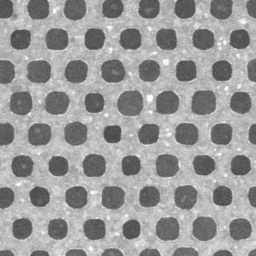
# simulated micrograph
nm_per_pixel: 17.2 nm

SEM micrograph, a regular array of holes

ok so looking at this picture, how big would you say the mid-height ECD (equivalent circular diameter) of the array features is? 0.403 microns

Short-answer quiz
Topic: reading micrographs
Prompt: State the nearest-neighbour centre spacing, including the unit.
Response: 617 nm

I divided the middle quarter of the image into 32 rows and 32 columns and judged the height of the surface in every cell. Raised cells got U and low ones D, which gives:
DDDDDDUUUDDDDDDUUUUDDDDDUUUUDDDD
DDDDDDUUUDDDDDDUUUDDDDDDUUUUDDDD
DDDDDDUUUDDDDDDUUUDDDDDDUUUUDDDD
DDDDDDUUUDDDDDDUUUUDDDDUUUUUDDDD
UDDDDUUUUUUDDDUUUUUUUDUUUUUUUUUU
UUUUUUUUUUUUUUUUUUUUUUUUUUUUUUUU
UUUUUUUUUUUUUUUUUDUUUUUUUUDUUUUU
DUUUUUDDDUUUUUDDDDDUUUUUDDDDUUUU
DUUUUDDDDDUUUDDDDDDDUUUDDDDDDUUU
DDUUUDDDDDUUUDDDDDDDUUUDDDDDDUUU
DUUUUDDDDDUUUDDDDDDDUUUDDDDDDUUU
DUUUUUDDDDUUUDDDDDDDUUUDDDDDUUUU
UUUUUUUUUUUUUUDDDDDUUUUUDDDUUUUU
UUUUUUUUUUUUUUUUUUUUUUUUUUUUUUUU
UUDDUUUUUUUUUUUUUUUUUUUUUUUUUUDU
DDDDDDUUUUUDDDUUUUUDDDDDUUUUDDDD
DDDDDDUUUUDDDDDUUUUDDDDDUUUUDDDD
DDDDDDUUUUDDDDDUUUDDDDDDUUUUDDDD
DDDDDDUUUUDDDDUUUUDDDDDDUUUUDDDD
UDDDDUUUUUUDDDUUUUUDDDDUUUUUDDDD
UUDDUUUUUUUUUUUUUUUUUUUUUUUUUUUU
UUUUUUUUUUUUUUUUUUUUUUUUUUUUUUUU
UUUUUUDDDUUUUUUUUUUUUUUUDDDUUUUU
UUUUUDDDDDUUUUUDDDDUUUUDDDDDUUUU
DUUUUDDDDDUUUUDDDDDUUUUDDDDDDUUU
DUUUDDDDDDDUUUDDDDDUUUUDDDDDDUUU
DUUUUDDDDDUUUUUDDDDUUUUDDDDDDUUU
DUUUUDDDDDUUUUUDDDUUUUUDDDDDUUUU
UUUUUUUUUUUUUUUUUUUUUUUUUDUUUUUU
UUUUUUUUUUUUUUUUUUUUUUUUUUUUUUUU
UUDDUUUUUUUDDUUUUUUUUUUUUUUUUDDD
UDDDDDUUUUDDDDDUUUUDDDDDUUUUDDDD